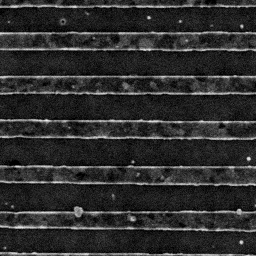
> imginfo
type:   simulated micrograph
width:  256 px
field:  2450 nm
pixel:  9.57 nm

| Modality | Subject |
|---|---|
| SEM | lines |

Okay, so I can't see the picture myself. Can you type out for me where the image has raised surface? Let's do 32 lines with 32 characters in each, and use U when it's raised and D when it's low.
UUUUUUUUUUUUUUUUUUUUUUUUUUUUUUUU
DDDDDDDDDDDDDDDDDDDDDDDDDDDDDDDD
DDDDDDDDDDDDDDDDDDDDDDDDDDDDDDDD
DDDDDDDDDDDDDDDDDDDDDDDDDDDDDDDD
UUUUUUUUUUUUUUUUUUUUUUUUUUUUUUUU
UUUUUUUUUUUUUUUUUUUUUUUUUUUUUUUU
DDDDDDDDDDDDDDDDDDDDDDDDDDDDDDDD
DDDDDDDDDDDDDDDDDDDDDDDDDDDDDDDD
DDDDDDDDDDDDDDDDDDDDDDDDDDDDDDDD
DDDDDDDDDDDDDDDDDDDDDDDDDDDDDDDD
UUUUUUUUUUUUUUUUUUUUUUUUUUUUUUUU
UUUUUUUUUUUUUUUUUUUUUUUUUUUUUUUU
DDDDDDDDDDDDDDDDDDDDDDDDDDDDDDDD
DDDDDDDDDDDDDDDDDDDDDDDDDDDDDDDD
DDDDDDDDDDDDDDDDDDDDDDDDDDDDDDDD
UUUUUUUUUUUUUUUUUUUUUUUUUUUUUUUU
UUUUUUUUUUUUUUUUUUUUUUUUUUUUUUUU
DDDDDDDDDDDDDDDDDDDDDDDDDDDDDDDD
DDDDDDDDDDDDDDDDDDDDDDDDDDDDDDDD
DDDDDDDDDDDDDDDDDDDDDDDDDDDDDDDD
DDDDDDDDDDDDDDDDDDDDDDDDDDDDDDDD
UUUUUUUUUUUUUUUUUUUUUUUUUUUUUUUU
UUUUUUUUUUUUUUUUUUUUUUUUUUUUUUUU
DDDDDDDDDDDDDDDDDDDDDDDDDDDDDDDD
DDDDDDDDDDDDDDDDDDDDDDDDDDDDDDDD
DDDDDDDDDDDDDDDDDDDDDDDDDDDDDDDD
DDDDDDDDDUUDDDDDDDDDDDUUUUDUUUUD
UUUUUUUUUUUUUUUUUUUUUUUUUUUUUUUU
DDDDDDDDDUUUUUUUUUUUUUUUUUUUUUUU
DDDDDDDDDDDDDDDDDDDDDDDDDDDDDDDD
DDDDDDDDDDDDDDDDDDDDDDDDDDDDDDDD
DDDDDDDDDDDDDDDDDDDDDDDDDDDDDDDD